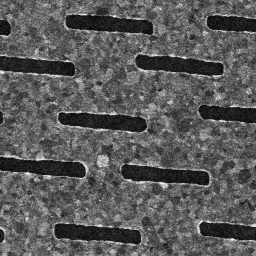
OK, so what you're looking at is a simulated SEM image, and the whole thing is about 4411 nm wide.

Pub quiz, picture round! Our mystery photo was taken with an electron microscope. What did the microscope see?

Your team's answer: holes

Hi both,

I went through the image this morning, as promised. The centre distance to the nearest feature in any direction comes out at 1390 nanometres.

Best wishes